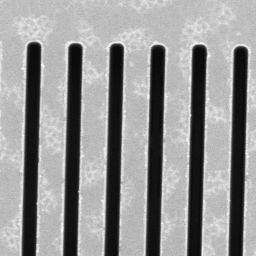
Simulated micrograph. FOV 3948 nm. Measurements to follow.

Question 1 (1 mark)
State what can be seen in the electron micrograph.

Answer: parallel lines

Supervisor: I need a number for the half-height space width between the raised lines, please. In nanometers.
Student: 193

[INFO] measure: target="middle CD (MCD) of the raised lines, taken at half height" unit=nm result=445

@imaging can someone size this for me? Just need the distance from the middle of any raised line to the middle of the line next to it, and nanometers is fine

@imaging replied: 637